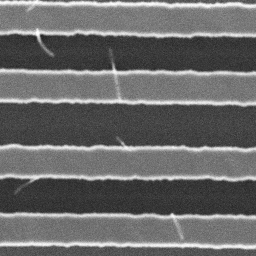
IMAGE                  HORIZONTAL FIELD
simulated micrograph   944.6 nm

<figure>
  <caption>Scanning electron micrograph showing lines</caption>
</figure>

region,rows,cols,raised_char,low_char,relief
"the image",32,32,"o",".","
ooooooooooooooooooooo.oooo.ooo..
oooooooooooooooooooooooooooooooo
oooooooooooooooooooooooooooooooo
oooooooooooooooooooooooooooooooo
...................oo.oo.....ooo
................................
................................
................................
................................
oooooooooooooooooooooooooooooooo
oooooooooooooooooooooooooooooooo
oooooooooooooooooooooooooooooooo
oooooooooooooooooooooooooooooooo
................................
................................
................................
................................
................................
oooooooooooooooooooooooo.o......
oooooooooooooooooooooooooooooooo
oooooooooooooooooooooooooooooooo
oooooooooooooooooooooooooooooooo
............................ooo.
................................
................................
................................
................................
oooooooooooooooooooooooooooooooo
oooooooooooooooooooooooooooooooo
oooooooooooooooooooooooooooooooo
oooooooooooooooooooooooooooooooo
................................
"